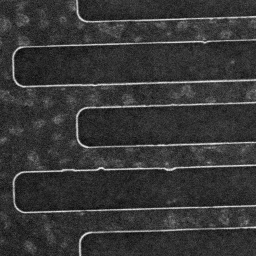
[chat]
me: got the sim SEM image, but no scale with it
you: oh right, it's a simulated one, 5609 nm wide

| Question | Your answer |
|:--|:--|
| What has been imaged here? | one or a few lines or trenches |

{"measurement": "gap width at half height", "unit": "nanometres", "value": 865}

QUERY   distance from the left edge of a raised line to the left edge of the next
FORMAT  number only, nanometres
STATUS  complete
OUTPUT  1380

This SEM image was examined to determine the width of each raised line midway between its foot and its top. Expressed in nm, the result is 496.